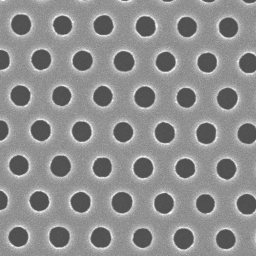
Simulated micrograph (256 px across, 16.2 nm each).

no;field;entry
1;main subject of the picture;a regular array of holes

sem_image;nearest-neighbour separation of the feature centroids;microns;0.657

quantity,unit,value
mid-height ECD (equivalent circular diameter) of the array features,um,0.332